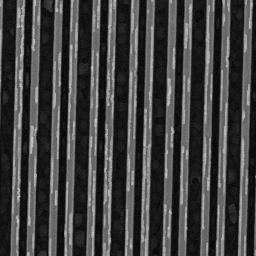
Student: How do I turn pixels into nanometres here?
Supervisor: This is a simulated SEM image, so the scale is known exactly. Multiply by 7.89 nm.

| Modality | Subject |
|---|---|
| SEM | parallel lines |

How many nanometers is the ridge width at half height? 61.1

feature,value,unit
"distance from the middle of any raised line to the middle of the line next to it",18.9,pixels